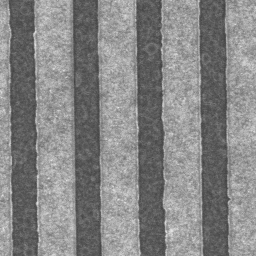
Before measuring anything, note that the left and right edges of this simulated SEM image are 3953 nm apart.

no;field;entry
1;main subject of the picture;one or a few lines or trenches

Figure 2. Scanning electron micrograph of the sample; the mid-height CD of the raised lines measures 583 nm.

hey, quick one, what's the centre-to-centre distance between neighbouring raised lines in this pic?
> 63.2 pixels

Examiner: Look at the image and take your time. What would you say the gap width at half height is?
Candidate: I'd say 399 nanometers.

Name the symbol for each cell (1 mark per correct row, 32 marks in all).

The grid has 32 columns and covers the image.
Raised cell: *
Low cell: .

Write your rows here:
*...*****...*****...*****...****
*...*****...*****...*****...****
*...*****...*****...*****...****
*...*****...*****...*****...****
*...*****...*****...*****...****
*...*****...*****...*****...****
*...*****...*****...*****...****
*...*****...*****...******..****
*...*****...*****...*****...****
*....****...*****...*****...****
*....****...*****...*****...****
*....****...*****...*****...****
*....****....****...*****...****
*....****....****...*****...****
*...*****....****...*****...****
*....****....****...*****...****
*....****....****....****...****
*....****....****....****...****
*....****....****...*****....***
*....****....****....****....***
*....****....****...*****....***
*....****....****...*****....***
*....****....****....****...****
*....****....****....****....***
*....****....****...*****....***
*....****....****...*****....***
*....****...*****....****....***
*....****....****....****....***
*....****....****....****....***
*....****....****....****....***
*....****....****....****....***
*..*.****....****....****....***